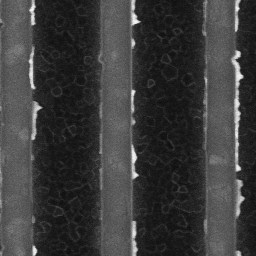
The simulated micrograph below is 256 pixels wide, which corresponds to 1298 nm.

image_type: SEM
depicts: one or a few lines or trenches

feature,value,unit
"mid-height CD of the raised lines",365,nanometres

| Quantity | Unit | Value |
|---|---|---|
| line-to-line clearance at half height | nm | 143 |